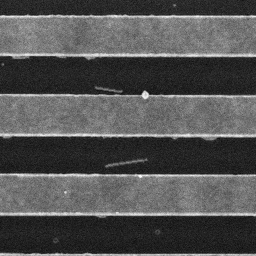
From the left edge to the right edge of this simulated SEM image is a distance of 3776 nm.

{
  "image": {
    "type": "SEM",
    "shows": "lines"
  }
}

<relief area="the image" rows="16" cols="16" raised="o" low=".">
................
oooooooooooooooo
oooooooooooooooo
.....ooooooooooo
................
................
oooooooooooooooo
oooooooooooooooo
..........oooooo
................
................
oooooooooooooooo
oooooooooooooooo
................
................
................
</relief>